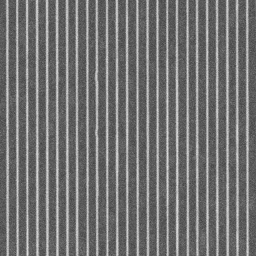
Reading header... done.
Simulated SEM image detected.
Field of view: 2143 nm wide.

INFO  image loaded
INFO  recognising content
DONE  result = parallel lines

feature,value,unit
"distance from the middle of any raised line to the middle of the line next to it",83.5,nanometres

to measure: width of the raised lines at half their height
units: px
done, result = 1.88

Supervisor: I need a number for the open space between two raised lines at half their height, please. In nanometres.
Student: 68